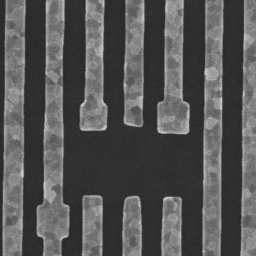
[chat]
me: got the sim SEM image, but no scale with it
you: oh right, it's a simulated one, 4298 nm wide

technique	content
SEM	wiring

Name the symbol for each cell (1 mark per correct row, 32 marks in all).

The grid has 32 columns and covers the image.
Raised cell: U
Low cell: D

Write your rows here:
DUUDDDUUDDDUUDDDUUDDDUUDDDUUDDDU
DUUDDDUUDDDUUDDDUUDDDUUDDDUUDDDU
DUUDDDUUDDDUUDDDUUDDDUUDDDUUDDDU
DUUDDDUUDDDUUDDDUUDDDUUDDDUUDDDU
DUUDDDUUDDDUUDDDUUDDDUUDDDUUDDDU
DUUDDDUUDDDUUDDDUUDDDUUDDDUUDDDU
DUUDDDUUDDDUUDDDUUDDDUUDDDUUDDDU
DUUDDDUUDDDUUDDDUUDDDUUDDDUUDDUU
DUUDDDUUDDDUUDDDUUDDDUUDDDUUDDUU
DUUDDDUUDDDUUDDDUUDDDUUDDDUUDDUU
DUUDDDUUDDDUUDDDUUDDDUUDDDUUDDUU
DUUDDDUUDDDUUDDDUUDDDUUDDDUUDDUU
DUUDDDUUDDDUUDDDUUDDUUUDDDUUDDUU
DUUDDDUUDDUUUDDDUUDDUUUUDDUUDDUU
DUUDDDUUDDUUUDDDUUDDUUUUDDUUDDUU
DUUDDDUUDDUUUDDDUUDDUUUUDDUUDDUU
DUUDDDUUDDDDDDDDDDDDUUUDDDUUDDUU
DUUDDUUUDDDDDDDDDDDDDDDDDDUUDDUU
DUUDDUUUDDDDDDDDDDDDDDDDDDUUDDUU
DUUDDUUUDDDDDDDDDDDDDDDDDDUUDDUU
DUUDDUUUDDDDDDDDDDDDDDDDDDUUDDUU
DUUDDDUUDDDDDDDDDDDDDDDDDDUUDDUU
DUUDDUUUDDDDDDDDDDDDDDDDDUUUDDUU
DUUDDUUUDDDDDDDDDDDDDDDDDUUUDDUU
DUUDDUUUDDDDDDDDDDDDDDDDDUUUDDUU
UUUDDUUUDDUUUDDDUUDDUUUDDUUUDDUU
UUUDDUUUUDUUUDDUUUDDUUUDDUUUDDUU
UUUDDUUUUDUUUDDUUUDDUUUDDUUUDDUU
UUUDDUUUUDUUUDDUUUDDUUUDDUUUDDUU
UUUDDUUUDDUUUDDUUUDDUUUDDUUUDDUU
UUUDDUUUDDUUUDDUUUDDUUUDDUUUDDUU
UUUDDUUUDDUUUDDUUUDDUUUDDUUUDDUU